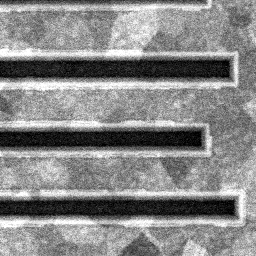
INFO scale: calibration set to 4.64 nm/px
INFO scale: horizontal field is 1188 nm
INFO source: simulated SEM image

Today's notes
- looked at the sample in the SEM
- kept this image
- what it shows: one or a few lines or trenches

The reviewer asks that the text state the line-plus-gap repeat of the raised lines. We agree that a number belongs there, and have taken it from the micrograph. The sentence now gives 331 nm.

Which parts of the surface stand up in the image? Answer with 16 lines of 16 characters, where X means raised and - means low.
XXXXXXXXXXXXXXXX
XXXXXXXXXXXXXXXX
XXXXXXXXXXXXXXXX
--------------XX
---------------X
XXXXXXXXXXXXXXXX
XXXXXXXXXXXXXXXX
XXXXXXXXXXXXXXXX
-------------XXX
------------XXXX
XXXXXXXXXXXXXXXX
XXXXXXXXXXXXXXXX
---------------X
---------------X
XXXXXXXXXXXXXXXX
XXXXXXXXXXXXXXXX